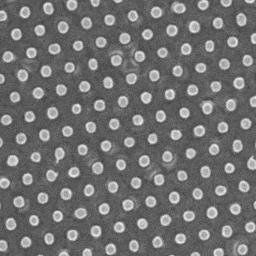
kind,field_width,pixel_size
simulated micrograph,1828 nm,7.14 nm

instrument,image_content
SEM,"a regular array of raised bodies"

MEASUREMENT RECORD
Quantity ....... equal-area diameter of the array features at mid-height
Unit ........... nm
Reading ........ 69.8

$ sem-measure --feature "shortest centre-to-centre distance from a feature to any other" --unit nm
166